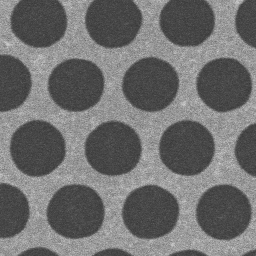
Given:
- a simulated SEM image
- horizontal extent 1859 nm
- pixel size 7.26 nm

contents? a regular array of holes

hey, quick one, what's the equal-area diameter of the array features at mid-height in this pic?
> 406 nm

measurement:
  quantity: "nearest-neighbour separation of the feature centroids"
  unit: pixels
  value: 73.4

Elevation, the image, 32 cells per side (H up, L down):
HHLLLLLLHHHLLLLLLHHHHLLLLLHHHHLL
HHLLLLLLHHHLLLLLLLHHLLLLLLLHHHLL
HLLLLLLLHHHLLLLLLLHHLLLLLLLHHLLL
HLLLLLLLHHHLLLLLLLHHLLLLLLLHHLLL
HHLLLLLLHHHLLLLLLHHHHLLLLLHHHHLL
HHHLLLLHHHHHLLLLHHHHHHLLLHHHHHHL
HHHHHHHHHHHHHHHHHHHHHHHHHHHHHHHH
LLHHHHHHLLLHHHHHHLLLHHHHHHHLLLHH
LLLHHHHLLLLLHHHHLLLLLLHHHLLLLLLH
LLLLHHLLLLLLLHHLLLLLLLHHHLLLLLLH
LLLLHHLLLLLLLHHLLLLLLLHHHLLLLLLH
LLLLHHLLLLLLLHHLLLLLLLHHHLLLLLLH
LLLHHHHLLLLLHHHHLLLLLLHHHLLLLLLH
LLHHHHHHLLLHHHHHHLLLLHHHHHLLLLHH
HHHHHHHHHHHHHHHHHHHHHHHHHHHHHHHH
HHHLLLHHHHHHHLLLHHHHHHLLLHHHHHHL
HHLLLLLHHHHLLLLLLHHHLLLLLLHHHHLL
HLLLLLLLHHHLLLLLLLHHLLLLLLLHHHLL
HLLLLLLLHHHLLLLLLLHHLLLLLLLHHLLL
HLLLLLLLHHHLLLLLLLHHLLLLLLLHHLLL
HHLLLLLLHHHLLLLLLHHHLLLLLLHHHHLL
HHHLLLHHHHHHLLLLHHHHHHLLLHHHHHHL
HHHHHHHHHHHHHHHHHHHHHHHHHHHHHHHH
LLHHHHHHLLLHHHHHHLLLHHHHHHLLLLHH
LLLHHHHLLLLLHHHHLLLLLLHHHLLLLLLH
LLLLHHLLLLLLLHHLLLLLLLHHHLLLLLLH
LLLLHHLLLLLLLHHLLLLLLLHHLLLLLLLL
LLLLHHLLLLLLLHHLLLLLLLHHHLLLLLLH
LLLHHHLLLLLLHHHHLLLLLLHHHLLLLLLH
LLHHHHHHLLLHHHHHHLLLHHHHHHLLLLHH
HHHHHHHHHHHHHHHHHHHHHHHHHHHHHHHH
HHHLLLLHHHHHLLLLHHHHHHLLLHHHHHHL